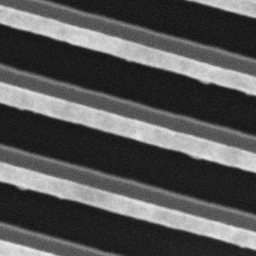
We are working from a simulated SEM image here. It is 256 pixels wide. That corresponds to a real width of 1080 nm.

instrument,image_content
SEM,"lines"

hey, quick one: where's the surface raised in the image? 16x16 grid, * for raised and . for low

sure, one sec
****..........**
********........
....*******.....
.......********.
*..........*****
*****.........**
********........
....********....
........*******.
*..........*****
*****..........*
.********.......
....********....
........********
**..........****
*****..........*